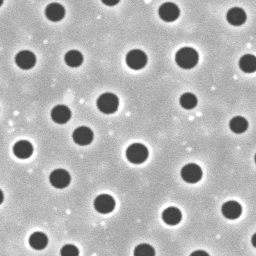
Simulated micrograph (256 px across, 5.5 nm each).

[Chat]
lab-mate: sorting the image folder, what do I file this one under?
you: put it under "a regular array of holes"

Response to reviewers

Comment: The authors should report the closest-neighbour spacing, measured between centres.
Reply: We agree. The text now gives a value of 0.263 µm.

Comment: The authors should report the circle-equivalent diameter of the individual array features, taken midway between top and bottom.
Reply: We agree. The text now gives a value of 115 nanometres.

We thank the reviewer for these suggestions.